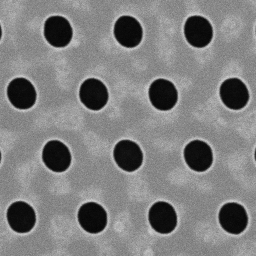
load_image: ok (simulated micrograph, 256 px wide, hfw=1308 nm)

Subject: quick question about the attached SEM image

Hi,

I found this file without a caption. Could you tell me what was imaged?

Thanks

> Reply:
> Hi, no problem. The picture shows a regular array of holes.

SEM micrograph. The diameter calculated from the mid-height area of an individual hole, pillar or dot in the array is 30.4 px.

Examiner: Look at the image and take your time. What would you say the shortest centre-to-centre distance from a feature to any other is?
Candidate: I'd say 359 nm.